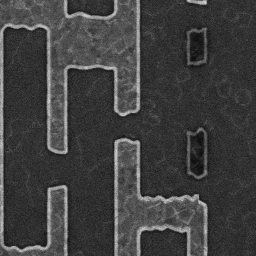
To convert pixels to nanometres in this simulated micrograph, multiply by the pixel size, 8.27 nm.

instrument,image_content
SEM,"one or a few lines or trenches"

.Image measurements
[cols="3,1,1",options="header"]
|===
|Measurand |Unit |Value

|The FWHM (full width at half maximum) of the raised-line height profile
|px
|17.4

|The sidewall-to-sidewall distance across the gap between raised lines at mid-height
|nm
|413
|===